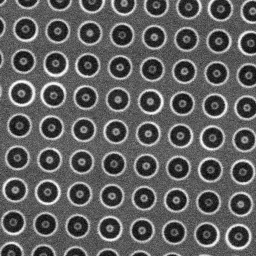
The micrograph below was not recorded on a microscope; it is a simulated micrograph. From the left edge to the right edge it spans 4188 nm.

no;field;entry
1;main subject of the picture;an array of small figures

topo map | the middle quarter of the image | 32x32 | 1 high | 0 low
01100110011000000111000001110000
11100000111000000110011001100010
11110000111100001110000001100000
11111111111110011111000011110000
11111111111111111111111111111001
11111111111111111111111111111111
11100001111100011111111111111111
11100000111000001111000011110001
11100100111001001110000011100000
11100000111000001110010001100100
11110001111000001110000011100100
11111111111110011111000011100000
11111111111111111111111111111001
11111111111111111111111111111111
11100001111100111111111111111111
11000000111000011110000111110011
11001000110000001110000011100000
11000001110000001100010011000100
11100001111000011100000011000100
11111111111100111110000111100000
11111111111111111111111111110011
11111111111111111111111111111111
11100011111001111111111111111111
11000001110000011110001111100111
11001001110010011100000111000001
11000001110010011100100111001001
11000011110000011100000111001001
11111111111000111110000111000001
11111111111111111111111111100011
11111111111111111111111111111111
11000011111001111111111111111111
10000001110000111100001111100111